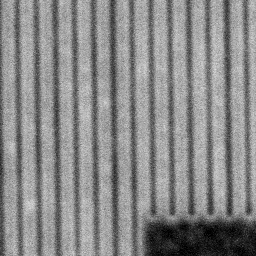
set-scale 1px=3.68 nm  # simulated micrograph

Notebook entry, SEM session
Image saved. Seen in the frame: parallel lines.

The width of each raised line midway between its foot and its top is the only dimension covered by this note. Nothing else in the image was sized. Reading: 43.7 nanometres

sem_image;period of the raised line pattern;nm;70.1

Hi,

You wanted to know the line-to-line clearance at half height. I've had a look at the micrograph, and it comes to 27.2 nm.